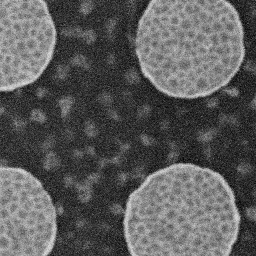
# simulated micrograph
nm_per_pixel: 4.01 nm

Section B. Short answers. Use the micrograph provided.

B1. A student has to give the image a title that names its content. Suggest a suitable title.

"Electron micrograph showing raised bodies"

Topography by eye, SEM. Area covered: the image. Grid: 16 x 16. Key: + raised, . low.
+++......++++++.
+++......++++++.
+++......++++++.
+++......++++++.
++.......++++++.
..........++++..
................
................
................
................
...........+....
++.......+++++..
+++.....+++++++.
+++.....+++++++.
+++.....+++++++.
+++.....++++++..